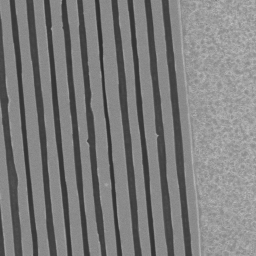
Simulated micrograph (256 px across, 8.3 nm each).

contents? parallel lines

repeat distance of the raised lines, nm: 140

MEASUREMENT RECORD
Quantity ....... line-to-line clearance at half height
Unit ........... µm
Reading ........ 0.0485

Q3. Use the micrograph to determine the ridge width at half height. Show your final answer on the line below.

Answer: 88.8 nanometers